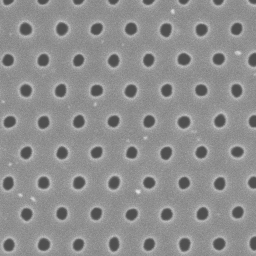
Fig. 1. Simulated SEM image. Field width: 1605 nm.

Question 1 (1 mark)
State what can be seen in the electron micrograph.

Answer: a regular array of holes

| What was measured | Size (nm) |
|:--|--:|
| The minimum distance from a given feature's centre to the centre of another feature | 217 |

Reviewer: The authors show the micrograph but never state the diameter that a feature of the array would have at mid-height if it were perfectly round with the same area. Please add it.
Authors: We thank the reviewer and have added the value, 75.1 nanometres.